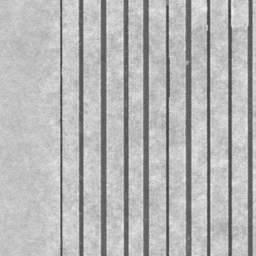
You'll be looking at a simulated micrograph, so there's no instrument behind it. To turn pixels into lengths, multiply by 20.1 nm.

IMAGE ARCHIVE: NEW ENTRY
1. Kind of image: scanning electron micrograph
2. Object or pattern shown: parallel lines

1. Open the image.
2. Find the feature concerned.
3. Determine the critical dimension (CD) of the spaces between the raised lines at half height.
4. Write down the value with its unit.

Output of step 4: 108 nm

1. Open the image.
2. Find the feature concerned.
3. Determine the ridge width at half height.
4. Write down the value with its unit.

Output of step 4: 0.322 um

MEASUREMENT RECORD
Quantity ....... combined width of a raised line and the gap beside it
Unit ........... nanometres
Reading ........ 425